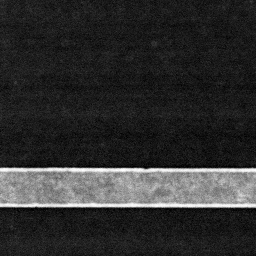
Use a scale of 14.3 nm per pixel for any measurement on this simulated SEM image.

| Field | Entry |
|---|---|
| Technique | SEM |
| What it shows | one or a few lines or trenches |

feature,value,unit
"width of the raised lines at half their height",511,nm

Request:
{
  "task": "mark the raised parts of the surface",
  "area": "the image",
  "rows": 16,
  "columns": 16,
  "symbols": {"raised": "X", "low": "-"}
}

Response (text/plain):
----------------
----------------
----------------
----------------
----------------
----------------
----------------
----------------
----------------
----------------
----------------
XXXXXXXXXXXXXXXX
XXXXXXXXXXXXXXXX
----------------
----------------
----------------